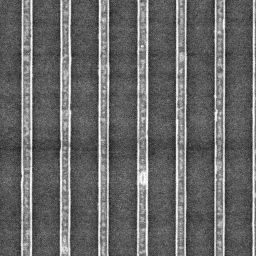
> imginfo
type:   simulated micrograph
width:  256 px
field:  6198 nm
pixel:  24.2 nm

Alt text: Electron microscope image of parallel lines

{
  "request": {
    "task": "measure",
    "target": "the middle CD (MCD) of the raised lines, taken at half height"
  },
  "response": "0.215 micrometres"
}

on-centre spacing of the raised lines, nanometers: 936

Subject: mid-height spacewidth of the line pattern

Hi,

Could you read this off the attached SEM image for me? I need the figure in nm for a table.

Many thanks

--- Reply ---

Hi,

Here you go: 720